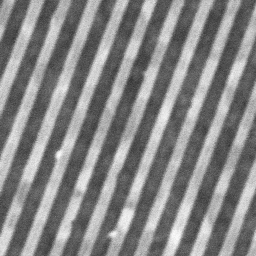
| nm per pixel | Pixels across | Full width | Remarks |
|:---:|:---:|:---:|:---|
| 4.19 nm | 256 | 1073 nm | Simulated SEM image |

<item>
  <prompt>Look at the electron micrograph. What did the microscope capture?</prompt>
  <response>parallel lines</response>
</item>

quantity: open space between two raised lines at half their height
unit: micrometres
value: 0.0725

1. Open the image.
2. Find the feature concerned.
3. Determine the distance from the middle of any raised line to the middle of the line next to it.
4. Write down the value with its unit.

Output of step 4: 111 nanometres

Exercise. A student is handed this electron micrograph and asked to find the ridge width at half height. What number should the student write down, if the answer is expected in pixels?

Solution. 9.59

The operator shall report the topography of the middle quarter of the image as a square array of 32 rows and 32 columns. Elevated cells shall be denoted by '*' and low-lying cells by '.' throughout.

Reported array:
***....***....***....***....***.
**.....**.....***....***....***.
**....***....***....***.....**..
**....***....***....***....***..
*.....**.....**.....**.....**...
*....***....***.....**....***...
*....***....***....***....***...
.....**.....**.....**.....**....
....***....***....***....***....
....**.....***....***....***....
...***.....**.....**.....**.....
...***....***....***....***....*
...**.....**.....**.....**.....*
..***....***.....**....***.....*
..***....**.....***....***....**
..**.....**.....**.....**.....**
.***....***....***....***.....**
.**.....**.....***....***....**.
***.....**.....**.....**.....**.
***....***....***....***....***.
**.....**.....**.....**.....**..
**....***.....**....***.....**..
**....**.....***....***....***..
*.....**.....**.....**.....**...
*....***....***....***.....**...
.....**.....***....***....***...
.....**.....**.....**.....**....
....***....**.....***....***....
....**.....**.....**.....**.....
....**.....**....***.....**.....
...**.....***....***....***....*
...**.....**.....**.....**.....*